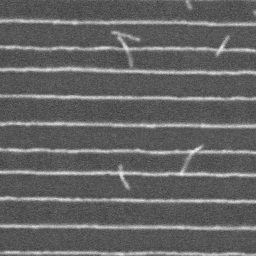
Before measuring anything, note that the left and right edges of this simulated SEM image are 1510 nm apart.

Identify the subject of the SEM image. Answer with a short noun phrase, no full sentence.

lines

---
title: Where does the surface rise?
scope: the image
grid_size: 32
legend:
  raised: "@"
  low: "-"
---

@@@@@@@@@@@@@@@@@@@@@@@@@@@@@@@@
@@@@@@@@@@@@@@@@@@@@@@@@@@@@@@@@
@@@@@@@@@@@@@@@@@@@@@@@@@@@@@@@@
--------------------------------
--------------------------------
--------------------------------
@@@@@@@@@@@@@@@@@@@@@@@@@@@@@@@@
@@@@@@@@@@@@@@@@@@@@@@@@@@@@@@@@
@@@@@@@@@@@@@@@@@@@@@@@@@@@@@@@@
--------------------------------
--------------------------------
--------------------------------
@@@@@@@@@@@@@@@@@@@@@@@@@@@@@@@@
@@@@@@@@@@@@@@@@@@@@@@@@@@@@@@@@
@@@@@@@@@@@@@@@@@@@@@@@@@@@@@@@@
----------@@@@@@@@@@@@@@@@@@@@@@
--------------------------------
--------------------------------
--------------------------------
@@@@@@@@@@@@@@@@@@@@@@@@@@@@@@@@
@@@@@@@@@@@@@@@@@@@@@@@@@@@@@@@@
@--@@@@@@@@@@@@@@@@@@@@@@@@@@@@@
--------------------------------
--------------------------------
--------------------------------
@@@@@@@@@@@@@@@@@@@@@@@@@@@@@@@@
@@@@@@@@@@@@@@@@@@@@@@@@@@@@@@@@
@@@@@@@@@@@@@@@@@@@@@@@@@@@@@@@@
------------------------@@@@@@@@
--------------------------------
--------------------------------
@@@--@--------------------------